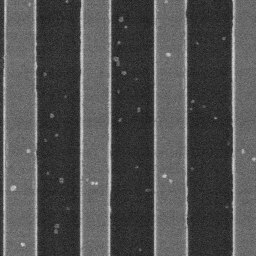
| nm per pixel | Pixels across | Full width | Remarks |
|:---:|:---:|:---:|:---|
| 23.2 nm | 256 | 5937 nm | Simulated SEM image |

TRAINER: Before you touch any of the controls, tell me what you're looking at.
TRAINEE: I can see lines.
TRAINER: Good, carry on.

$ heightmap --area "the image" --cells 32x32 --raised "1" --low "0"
01110000001111000001111000000111
01110000001111000001111000000111
01110000001111000001111000000111
01110000001111000001111000000111
01110000001111000001111000000111
01110000001111000001111000000111
01110000001111000001111000000111
01110000001111000001111000000111
01110000001111000001111000000111
01110000001111000001111000000111
01110000001111000001111000000111
01111000001111000001111000000111
01111000001111000001111000000111
01111000001111000001111000000111
01111000001111000001111000000111
01111000001111000001111000000111
01111000001111000001111000000111
01111000001111000001111000000111
01111000001111000001111000000111
01110000001111000001111000000111
01111000001111000001111000000111
01111000001111000001111000000111
01111000001111000001111000000111
01111000001111000001111000000111
01111000001111000001111000000111
01111000001111000001111000000111
01111000001111000001111000000111
01111000001111000001111000000111
01111000001111000001111000000111
01111000001111000001111000000111
01111000001111000001111000000111
01111000001111000001111000000111